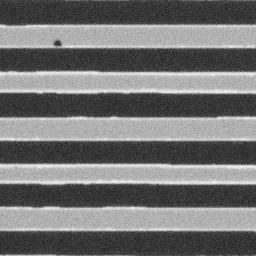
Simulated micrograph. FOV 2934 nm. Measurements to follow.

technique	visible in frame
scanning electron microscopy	lines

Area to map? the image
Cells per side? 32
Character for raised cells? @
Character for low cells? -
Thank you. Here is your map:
--------------------------------
--------------------------------
--------------------------------
@@@@@@@@@@@@@@@@@@@@@@@@@@@@@@@@
@@@@@@@@@@@@@@@@@@@@@@@@@@@@@@@@
@@@@@@@@@@@@@@@@@@@@@@@@@@@@@@@@
--------------------------------
--------------------------------
--------------------------------
@@@@@@@@@@@@@@@@@@@@@@@@@@@@@@@@
@@@@@@@@@@@@@@@@@@@@@@@@@@@@@@@@
---------------------@@---@@@@@@
--------------------------------
--------------------------------
--------------------------------
@@@@@@@@@@@@@@@@@@@@@@@@@@@@@@@@
@@@@@@@@@@@@@@@@@@@@@@@@@@@@@@@@
--------------------------------
--------------------------------
--------------------------------
--------------------------------
@@@@@@@@@@@@@@@@@@@@@@@@@@@@@@@@
@@@@@@@@@@@@@@@@@@@@@@@@@@@@@@@@
--------------------------------
--------------------------------
--------------------------------
@@@@@@@@@@@@@@@@@@@@@@@@@@@@@@@@
@@@@@@@@@@@@@@@@@@@@@@@@@@@@@@@@
@@@@@@@@@@@@@@@@@@@@@@@@@@@@@@@@
--------------------------------
--------------------------------
--------------------------------